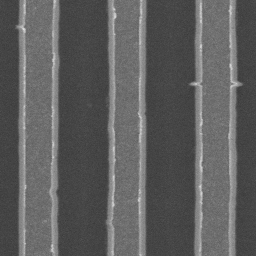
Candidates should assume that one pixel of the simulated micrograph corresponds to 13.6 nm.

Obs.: one or a few lines or trenches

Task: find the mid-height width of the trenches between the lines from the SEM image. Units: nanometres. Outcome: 767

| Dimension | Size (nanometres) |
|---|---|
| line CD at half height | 439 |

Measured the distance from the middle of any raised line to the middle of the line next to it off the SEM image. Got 1200 nanometers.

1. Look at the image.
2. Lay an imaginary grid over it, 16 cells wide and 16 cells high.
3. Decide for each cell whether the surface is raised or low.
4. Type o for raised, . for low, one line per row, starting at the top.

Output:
.oo....oo...ooo.
.oo....oo...oo..
.oo....oo...ooo.
.oo....oo...ooo.
.oo....oo...ooo.
.oo....oo...ooo.
.oo....oo...ooo.
.oo....oo...ooo.
.oo....oo...oo..
.oo....oo...ooo.
.oo....oo...ooo.
.oo....oo...ooo.
.oo....oo...ooo.
.oo....oo...oo..
.oo....oo...oo..
.oo....oo...ooo.